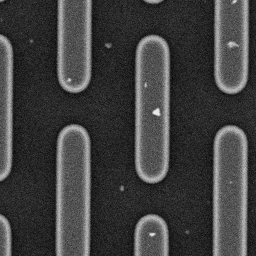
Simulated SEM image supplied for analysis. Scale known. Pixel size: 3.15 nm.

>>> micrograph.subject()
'groups of lines, slits or small figures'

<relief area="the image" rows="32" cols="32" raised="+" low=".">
........+++................++++.
........+++................++++.
.......++++................++++.
.......++++................++++.
.......++++................++++.
+......++++.......+++......++++.
+......++++......++++......++++.
+......++++......++++......++++.
+......++++......++++......++++.
+......++++......++++......++++.
+.......+++......++++......++++.
+................++++.......+...
+................++++...........
+................++++...........
+................++++...........
+................++++...........
+.......+++......++++.......++..
+......++++......++++......++++.
+......++++......++++......++++.
+......++++......++++......++++.
+......++++......++++......++++.
+......++++......++++......++++.
.......++++.......++.......++++.
.......++++................++++.
.......++++................++++.
.......++++................++++.
.......++++................++++.
+......++++.......++.......++++.
+......++++......++++......++++.
+......++++......++++......++++.
+......++++......++++......++++.
+......++++......++++......++++.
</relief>